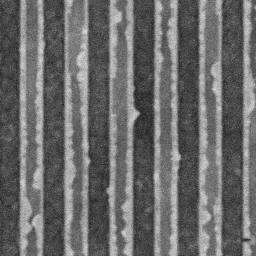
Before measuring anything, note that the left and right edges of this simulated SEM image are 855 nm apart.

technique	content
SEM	parallel lines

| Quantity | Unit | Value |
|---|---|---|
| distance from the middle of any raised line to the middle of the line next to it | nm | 149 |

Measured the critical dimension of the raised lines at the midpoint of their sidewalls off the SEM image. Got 0.0684 um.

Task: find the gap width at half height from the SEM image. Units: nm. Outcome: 80.9